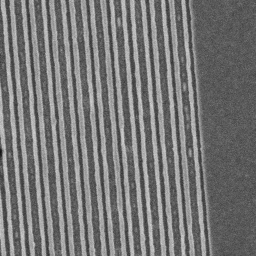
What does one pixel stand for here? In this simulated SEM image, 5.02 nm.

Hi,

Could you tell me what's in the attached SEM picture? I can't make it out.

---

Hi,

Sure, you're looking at parallel lines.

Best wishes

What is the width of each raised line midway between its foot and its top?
19.4 nm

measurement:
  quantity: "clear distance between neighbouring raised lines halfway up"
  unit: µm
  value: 0.0288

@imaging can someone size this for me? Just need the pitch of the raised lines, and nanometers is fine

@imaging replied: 50.3